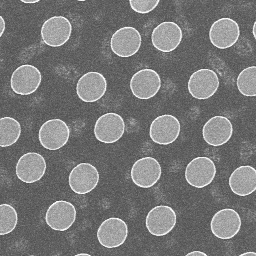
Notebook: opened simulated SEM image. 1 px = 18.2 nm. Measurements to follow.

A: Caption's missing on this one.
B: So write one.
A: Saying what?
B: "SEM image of a regular array of raised bodies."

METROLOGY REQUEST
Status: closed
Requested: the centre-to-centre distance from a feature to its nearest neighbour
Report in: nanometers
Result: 830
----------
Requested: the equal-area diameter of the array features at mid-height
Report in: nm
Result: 533